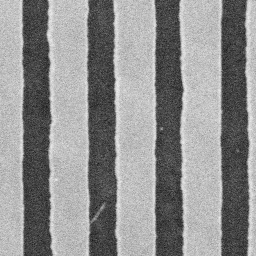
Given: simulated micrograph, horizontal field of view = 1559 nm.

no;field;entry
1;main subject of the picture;lines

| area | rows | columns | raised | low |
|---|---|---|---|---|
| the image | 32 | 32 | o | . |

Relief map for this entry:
ooo...ooooo...ooooo...oooooo...o
ooo...ooooo...ooooo...oooooo...o
ooo...ooooo...ooooo...oooooo...o
ooo...ooooo...ooooo....ooooo...o
ooo...ooooo...ooooo....ooooo...o
ooo...ooooo...ooooo....ooooo...o
ooo...ooooo...ooooo....ooooo...o
ooo...ooooo...ooooo....ooooo...o
ooo...ooooo...ooooo....ooooo...o
ooo...ooooo...ooooo....ooooo...o
ooo...ooooo...ooooo....ooooo...o
ooo...ooooo...ooooo....ooooo...o
ooo...ooooo...ooooo....ooooo...o
ooo...ooooo...ooooo....ooooo...o
ooo...ooooo....oooo....ooooo...o
ooo...ooooo....oooo....ooooo...o
ooo...ooooo....oooo....ooooo...o
ooo...ooooo...ooooo....oooo....o
ooo...ooooo...ooooo....ooooo...o
ooo...ooooo....oooo....ooooo...o
ooo...ooooo...ooooo....ooooo...o
ooo...ooooo...ooooo....ooooo...o
ooo...ooooo....oooo....ooooo...o
ooo...ooooo....oooo....ooooo...o
ooo...ooooo....oooo....ooooo...o
ooo...ooooo....oooo....ooooo...o
ooo...ooooo....oooo....ooooo...o
ooo...ooooo....oooo....ooooo...o
ooo...ooooo...ooooo....ooooo...o
ooo...ooooo....oooo....ooooo...o
ooo...ooooo....oooo....ooooo...o
ooo....oooo....oooo....ooooo...o